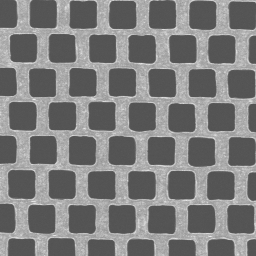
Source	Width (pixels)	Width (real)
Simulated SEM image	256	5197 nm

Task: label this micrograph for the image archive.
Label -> a regular array of holes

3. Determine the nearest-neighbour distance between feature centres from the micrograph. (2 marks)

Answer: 0.791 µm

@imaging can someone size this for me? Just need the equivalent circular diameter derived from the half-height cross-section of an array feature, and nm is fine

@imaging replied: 628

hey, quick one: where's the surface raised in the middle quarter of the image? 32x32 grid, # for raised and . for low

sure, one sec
################################
#.......###.......####.....#####
#.......###.......###.......###.
#.......###.......###.......###.
#.......###.......###.......###.
#.......###.......###.......###.
#.......###.......###.......###.
#.......###.......###.......###.
################################
..#####.....####################
...###.......###.......###......
...###.......###.......###......
...###.......###.......###......
...###.......###.......###......
...###.......###.......###......
...###.......###.......###......
...####......####.....#####.....
################################
#.......###......####......#####
#.......###.......###.......###.
#.......###.......###.......###.
#.......###.......###.......###.
#.......###.......###.......###.
#.......###.......###.......###.
#.......###.......###.......###.
################################
################################
...###.......###.......###......
...###.......###.......###......
...###.......###.......###......
...###.......###.......###......
...###.......###.......###......